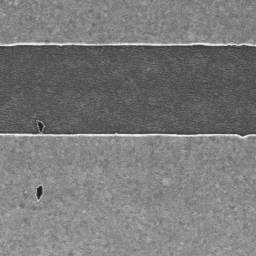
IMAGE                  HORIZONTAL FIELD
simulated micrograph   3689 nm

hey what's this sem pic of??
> one or a few lines or trenches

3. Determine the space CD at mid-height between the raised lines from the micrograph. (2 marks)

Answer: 1310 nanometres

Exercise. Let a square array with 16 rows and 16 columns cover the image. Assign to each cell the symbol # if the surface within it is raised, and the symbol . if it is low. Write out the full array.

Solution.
################
################
################
................
................
................
................
................
###########.###.
################
################
################
################
################
################
################